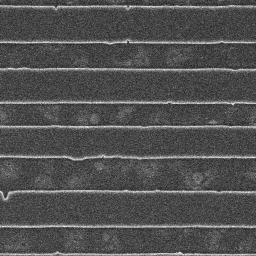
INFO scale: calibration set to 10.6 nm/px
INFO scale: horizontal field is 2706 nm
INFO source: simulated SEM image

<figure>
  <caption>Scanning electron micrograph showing parallel lines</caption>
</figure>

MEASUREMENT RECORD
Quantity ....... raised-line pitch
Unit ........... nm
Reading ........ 651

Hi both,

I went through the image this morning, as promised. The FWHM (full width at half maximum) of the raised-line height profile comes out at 369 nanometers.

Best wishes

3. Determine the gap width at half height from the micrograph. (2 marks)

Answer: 278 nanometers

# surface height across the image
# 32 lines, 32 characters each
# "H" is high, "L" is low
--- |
LLLLLLLLLLLLLLLLLLLLLLLLLLLLLLLL
HHHHHHHHHHHHHHHHHHHHHHHHHHHHHHHH
HHHHHHHHHHHHHHHHHHHHHHHHHHHHHHHH
HHHHHHHHHHHHHHHHHHHHHHHHHHHHHHHH
HHHHHHHHHHHHHHHHHHHHHHHHHHHHHHHH
LLLLLLLLLLLLLLLLLLLLLLLLLLLLLLLL
LLLLLLLLLLLLLLLLLLLLLLLLLLLLLLLL
LLLLLLLLLLLLLLLLLLLLLLLLLLLLLLLL
LLLLLLLLLLLLLLLLLLLLLLLLLLLLLLLL
HHHHHHHHHHHHHHHHHHHHHHHHHHHHHHHH
HHHHHHHHHHHHHHHHHHHHHHHHHHHHHHHH
HHHHHHHHHHHHHHHHHHHHHHHHHHHHHHHH
HHHHHHHHHHHHHHHHHHHHHHHHHHHHHHHH
LLLLLLLLLLLLLLLLLLLLLLLLLLLLLLLL
LLLLLLLLLLLLLLLLLLLLLLLLLLLLLLLL
LLLLLLLLLLLLLLLLLLLLLLLLLLLLLLLL
HHHHHHHHHHHHHHHHHHHHHHHHHHHHHHHH
HHHHHHHHHHHHHHHHHHHHHHHHHHHHHHHH
HHHHHHHHHHHHHHHHHHHHHHHHHHHHHHHH
HHHHHHHHHHHHHHHHHHHHHHHHHHHHHHHH
LLLLLLLLLLLLLLLLLLLLLLLLLLLLLLLL
LLLLLLLLLLLLLLLLLLLLLLLLLLLLLLLL
LLLLLLLLLLLLLLLLLLLLLLLLLLLLLLLL
LLLLLLLLLLLLLLLLLLLLLLLLLLLLLLLL
HHHHHHHHHHHHHHHHHHHHHHHHHHHHHHHH
HHHHHHHHHHHHHHHHHHHHHHHHHHHHHHHH
HHHHHHHHHHHHHHHHHHHHHHHHHHHHHHHH
HHHHHHHHHHHHHHHHHHHHHHHHHHHHHHHH
LLLLLLLLLLLLLLLLLLLLLLLLLLLLLLLL
LLLLLLLLLLLLLLLLLLLLLLLLLLLLLLLL
LLLLLLLLLLLLLLLLLLLLLLLLLLLLLLLL
LLLLLLLLLLLLLLLLLLLLLLLLLLLLLLLL